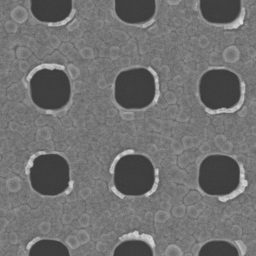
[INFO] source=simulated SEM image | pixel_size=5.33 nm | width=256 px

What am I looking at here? holes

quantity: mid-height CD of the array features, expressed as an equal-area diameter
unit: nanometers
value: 227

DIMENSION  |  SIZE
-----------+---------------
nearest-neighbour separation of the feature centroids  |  452 nm